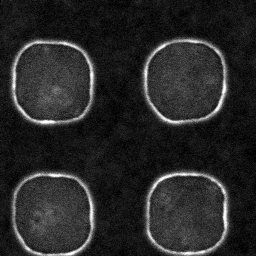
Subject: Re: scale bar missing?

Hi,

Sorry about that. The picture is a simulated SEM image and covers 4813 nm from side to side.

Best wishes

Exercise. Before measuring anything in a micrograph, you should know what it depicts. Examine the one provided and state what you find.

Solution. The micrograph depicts holes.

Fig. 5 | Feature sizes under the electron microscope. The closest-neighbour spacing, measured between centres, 2490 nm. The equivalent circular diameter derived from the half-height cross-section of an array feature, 1530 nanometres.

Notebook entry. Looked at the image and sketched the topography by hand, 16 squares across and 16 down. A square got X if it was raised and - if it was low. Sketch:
XXXXXXXXXXXXXXXX
XXXXXXXXXXXXXXXX
XXXXXXXXXXXXXXXX
X----XXXXX----XX
X-----XXX-----XX
X-----XXX-----XX
X-----XXXX----XX
XX--XXXXXXX-XXXX
XXXXXXXXXXXXXXXX
XXXXXXXXXXXXXXXX
XXXXXXXXXXXXXXXX
X----XXXXX----XX
X-----XXX-----XX
X-----XXX-----XX
X-----XXX-----XX
XX---XXXXX---XXX